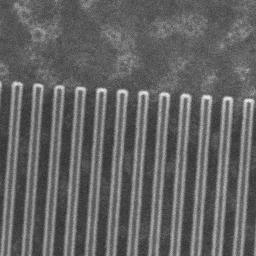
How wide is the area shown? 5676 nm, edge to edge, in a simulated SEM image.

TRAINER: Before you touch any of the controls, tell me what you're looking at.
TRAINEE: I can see parallel lines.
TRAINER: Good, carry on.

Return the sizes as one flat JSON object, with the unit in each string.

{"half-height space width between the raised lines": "0.293 µm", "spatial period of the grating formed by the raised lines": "468 nm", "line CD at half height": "7.98 pixels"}